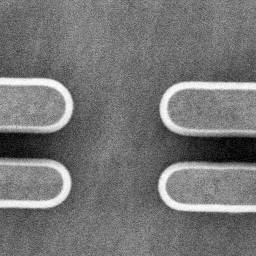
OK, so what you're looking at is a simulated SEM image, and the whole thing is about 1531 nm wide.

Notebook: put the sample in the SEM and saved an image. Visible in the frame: groups of lines, slits or small figures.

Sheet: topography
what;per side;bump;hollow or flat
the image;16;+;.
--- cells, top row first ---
................
................
................
................
................
++++.......+++++
++++......++++++
++++......++++++
................
................
++++.......+++++
++++......++++++
++++......++++++
................
................
................